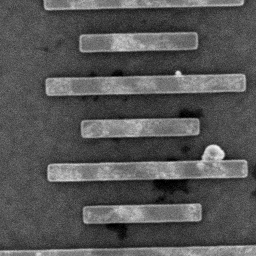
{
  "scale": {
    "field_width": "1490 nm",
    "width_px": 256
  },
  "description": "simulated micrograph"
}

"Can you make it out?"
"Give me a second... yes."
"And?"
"groups of lines, slits or small figures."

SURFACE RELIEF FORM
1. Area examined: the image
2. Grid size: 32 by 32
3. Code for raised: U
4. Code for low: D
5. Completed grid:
DDDDDDUUUUUUUUUUUUUUUUUUUUUUUUDD
DDDDDDDDDDDDDDDDDDDDDDDDDDDDDDDD
DDDDDDDDDDDDDDDDDDDDDDDDDDDDDDDD
DDDDDDDDDDDDDDDDDDDDDDDDDDDDDDDD
DDDDDDDDDDUUUUUUUUUUUUUUUDDDDDDD
DDDDDDDDDDUUUUUUUUUUUUUUUDDDDDDD
DDDDDDDDDDDDDDDDDDDDDDDDDDDDDDDD
DDDDDDDDDDDDDDDDDDDDDDDDDDDDDDDD
DDDDDDDDDDDDDDDDDDDDDDDDDDDDDDDD
DDDDDDDDDDDDDDDDDDDDDDDUUUUUUUDD
DDDDDDUUUUUUUUUUUUUUUUUUUUUUUUUD
DDDDDDUUUUUUUUUUUUUUUUUDDDDDDDDD
DDDDDDDDDDDDDDDDDDDDDDDDDDDDDDDD
DDDDDDDDDDDDDDDDDDDDDDDDDDDDDDDD
DDDDDDDDDDDDDDDDDDDDDDDDDDDDDDDD
DDDDDDDDDDUUUUUUUUUUUUUUUDDDDDDD
DDDDDDDDDDUUUUUUUUUUUUUUUDDDDDDD
DDDDDDDDDDDDDDDDDDDDDDDDDDDDDDDD
DDDDDDDDDDDDDDDDDDDDDDDDDDUDDDDD
DDDDDDDDDDDDDDDDDDDDDDDDDDUUDDDD
DDDDDDDDDDDDUUUUUUUUUUUUUUUUUUUD
DDDDDDUUUUUUUUUUUUUUUUUUUUUUUUUD
DDDDDDUUUUUDDDDDDDDDDDDDDDDDDDDD
DDDDDDDDDDDDDDDDDDDDDDDDDDDDDDDD
DDDDDDDDDDDDDDDDDDDDDDDDDDDDDDDD
DDDDDDDDDDDDDDDDDDDDDDDDDDDDDDDD
DDDDDDDDDDUUUUUUUUUUUUUUUDDDDDDD
DDDDDDDDDDDUUUUUUUUUUUUUUDDDDDDD
DDDDDDDDDDDDDDDDDDDDDDDDDDDDDDDD
DDDDDDDDDDDDDDDDDDDDDDDDDDDDDDDD
DDDDDDDDDDDDDDDDDDDDDDDDDDDDDDDD
UUUUUUUUUUUUUUUUUUUUUUUUUUUUUUUU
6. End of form